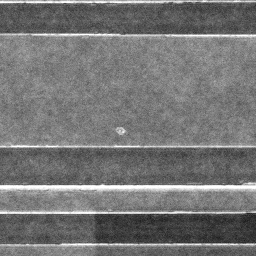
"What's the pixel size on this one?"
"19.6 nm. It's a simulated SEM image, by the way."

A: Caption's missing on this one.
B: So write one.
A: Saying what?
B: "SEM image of lines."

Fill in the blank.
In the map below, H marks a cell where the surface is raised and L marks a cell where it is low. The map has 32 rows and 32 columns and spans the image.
LLLLLLLLLLLLLLLLLLLLLLLLLLLLLLLL
LLLLLLLLLLLLLLLLLLLLLLLLLLLLLLLL
LLLLLLLLLLLLLLLLLLLLLLLLLLLLLLLL
LLLLLLLLLLLLLLLLLLLLLLLLLLLLLLLL
HHHHHHHHHHHHHHHHHHHHHHHHHHHHHHHH
HHHHHHHHHHHHHHHHHHHHHHHHHHHHHHHH
HHHHHHHHHHHHHHHHHHHHHHHHHHHHHHHH
HHHHHHHHHHHHHHHHHHHHHHHHHHHHHHHH
HHHHHHHHHHHHHHHHHHHHHHHHHHHHHHHH
HHHHHHHHHHHHHHHHHHHHHHHHHHHHHHHH
HHHHHHHHHHHHHHHHHHHHHHHHHHHHHHHH
HHHHHHHHHHHHHHHHHHHHHHHHHHHHHHHH
HHHHHHHHHHHHHHHHHHHHHHHHHHHHHHHH
HHHHHHHHHHHHHHHHHHHHHHHHHHHHHHHH
HHHHHHHHHHHHHHHHHHHHHHHHHHHHHHHH
HHHHHHHHHHHHHHHHHHHHHHHHHHHHHHHH
HHHHHHHHHHHHHHHHHHHHHHHHHHHHHHHH
HHHHHHHHHHHHHHHHHHHHHHHHHHHHHHHH
LLLLLLLLLLLLLLLLLLLLLLLLLLLLLLLL
LLLLLLLLLLLLLLLLLLLLLLLLLLLLLLLL
LLLLLLLLLLLLLLLLLLLLLLLLLLLLLLLL
LLLLLLLLLLLLLLLLLLLLLLLLLLLLLLLL
LLLLLLLLLLLLLLLLLLLLLLLLLLLLLLLL
HHHHHHHHHHHHHHHHHHHHHHHHHHHHHHHH
HHHHHHHHHHHHHHHHHHHHHHHHHHHHHHHH
HHHHHHHHHHHHHHHHHHHHHHHHHHHHHHHH
HHHHHHHHHHHHHHHHLLLLLLLLLLLLLLLL
LLLLLLLLLLLLLLLLLLLLLLLLLLLLLLLL
LLLLLLLLLLLLLLLLLLLLLLLLLLLLLLLL
LLLLLLLLLLLLLLLLLLLLLLLLLLLLLLLL
LLLLLLLLLLLLLLLLLLLLLLLLLLLLLLLL
HHHHHHHHHHHHHHHHHHHHHHHHHHHHHHHH